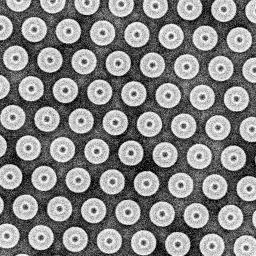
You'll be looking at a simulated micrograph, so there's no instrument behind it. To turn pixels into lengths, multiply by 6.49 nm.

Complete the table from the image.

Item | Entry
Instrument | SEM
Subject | an array of small figures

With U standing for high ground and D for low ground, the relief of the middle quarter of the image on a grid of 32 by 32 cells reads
DDUUUUUUDDDUUUUUUDDUUUUUUDDDUUUU
DDDUUUUDDDDUUUUUDDDUUUUUUDDDUUUU
DDDDDDDDDDDDUUUDDDDDUUUUDDDDUUUU
DDDDDDDDDDDDDDDDDDDDDDDDDDDDDUUU
UUUDDDDUUUUDDDDDDUDDDDDDDDDDDDDD
UUUDDDUUUUUUDDDUUUUUDDDDUUUUDDDD
UUUDDDUUUUUUDDDUUUUUDDDUUUUUUDDD
UUUDDDUUUUUUDDUUUUUUDDDUUUUUUDDD
UUUDDDUUUUUUDDDUUUUUDDDUUUUUUDDD
UDDDDDDUUUUDDDDUUUUUDDDUUUUUUDDD
DDDDDDDDDDDDDDDDDDDDDDDDUUUUDDDD
DDDUUUDDDDDDDDDDDDDDDDDDDDDDDDDD
DDUUUUUDDDDUUUUDDDDDUUUDDDDDDDDD
DUUUUUUDDDUUUUUUDDDUUUUUDDDDUUUU
DUUUUUUDDDUUUUUUDDUUUUUUDDDUUUUU
DUUUUUUDDDUUUUUUDDUUUUUUDDDUUUUU
DDUUUUDDDDUUUUUDDDDUUUUUDDDUUUUU
DDDDDDDDDDDDUUDDDDDDUUUDDDDDUUUU
UDDDDDDDDDDDDDDDDDDDDDDDDDDDDDDD
UUDDDDUUUUDDDDDUUUDDDDDDDDDDDDDD
UUUDDUUUUUUDDDUUUUUDDDDUUUUDDDDD
UUUDDUUUUUUDDDUUUUUUDDDUUUUUDDDU
UUDDDUUUUUUDDDUUUUUUDDUUUUUUDDDU
UUDDDDUUUUUDDDUUUUUUDDUUUUUUDDDU
DDDDDDDUUUDDDDDUUUUDDDDUUUUUDDDU
DDDDDDDDDDDDDDDDDDDDDDDDUUUDDDDD
DDUUUDDDDDDUUDDDDDDDDDDDDDDDDDDD
DUUUUUDDDDUUUUUDDDDUUUUDDDDDUUDD
DUUUUUUDDUUUUUUDDDUUUUUDDDDUUUUU
DUUUUUUDDUUUUUUDDDUUUUUUDDUUUUUU
DUUUUUDDDUUUUUUDDDUUUUUUDDUUUUUU
DDUUUDDDDDUUUUDDDDUUUUUDDDUUUUUU